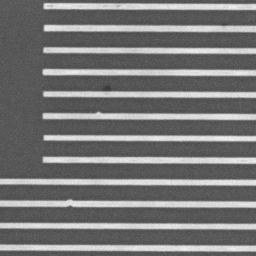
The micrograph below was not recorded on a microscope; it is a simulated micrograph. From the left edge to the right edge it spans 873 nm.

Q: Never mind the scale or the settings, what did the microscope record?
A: parallel lines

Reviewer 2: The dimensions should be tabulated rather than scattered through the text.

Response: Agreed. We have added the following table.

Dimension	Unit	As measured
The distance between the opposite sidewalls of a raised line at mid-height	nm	17.5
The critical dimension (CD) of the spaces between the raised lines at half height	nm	55.4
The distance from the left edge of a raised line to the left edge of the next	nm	74.8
